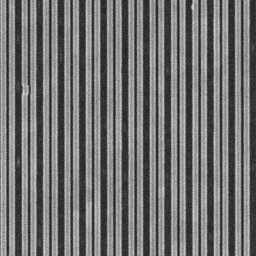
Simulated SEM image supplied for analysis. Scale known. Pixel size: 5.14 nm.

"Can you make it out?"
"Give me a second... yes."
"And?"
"parallel lines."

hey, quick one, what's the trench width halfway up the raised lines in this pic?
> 36 nanometres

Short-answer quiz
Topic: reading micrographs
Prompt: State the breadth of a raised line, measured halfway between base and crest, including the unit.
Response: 5 px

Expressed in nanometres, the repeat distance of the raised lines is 54.3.